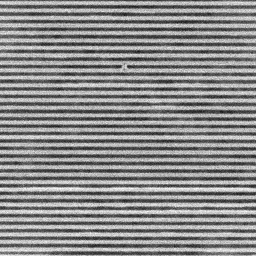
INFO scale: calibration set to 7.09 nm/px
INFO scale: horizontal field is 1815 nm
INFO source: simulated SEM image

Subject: parallel lines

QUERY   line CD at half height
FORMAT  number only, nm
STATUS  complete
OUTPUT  19.5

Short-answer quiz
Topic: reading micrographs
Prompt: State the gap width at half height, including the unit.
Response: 31.9 nanometers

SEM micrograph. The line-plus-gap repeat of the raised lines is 7.48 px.